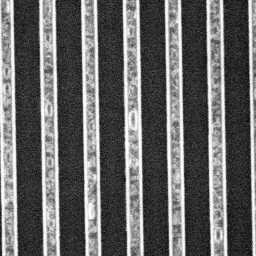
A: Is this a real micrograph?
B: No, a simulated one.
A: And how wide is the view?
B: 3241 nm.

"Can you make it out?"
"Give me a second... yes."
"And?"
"parallel lines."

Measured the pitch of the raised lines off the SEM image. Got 529 nm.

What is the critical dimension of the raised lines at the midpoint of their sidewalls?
13.6 pixels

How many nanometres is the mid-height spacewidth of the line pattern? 354